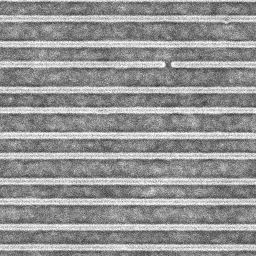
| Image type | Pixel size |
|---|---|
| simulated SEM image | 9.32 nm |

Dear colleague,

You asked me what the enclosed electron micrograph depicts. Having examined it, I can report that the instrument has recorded parallel lines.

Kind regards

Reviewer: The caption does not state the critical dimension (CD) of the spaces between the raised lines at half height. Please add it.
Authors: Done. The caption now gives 148 nm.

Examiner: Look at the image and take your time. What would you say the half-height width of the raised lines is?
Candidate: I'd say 4.62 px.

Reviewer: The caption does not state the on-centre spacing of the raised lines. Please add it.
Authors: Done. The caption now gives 213 nanometers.